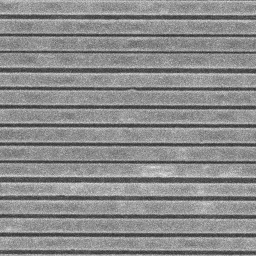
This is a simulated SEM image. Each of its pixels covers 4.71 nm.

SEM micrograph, parallel lines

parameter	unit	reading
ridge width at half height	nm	64.8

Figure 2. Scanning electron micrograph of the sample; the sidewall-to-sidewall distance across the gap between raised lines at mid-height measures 0.0218 micrometres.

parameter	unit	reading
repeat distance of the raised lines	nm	85.3